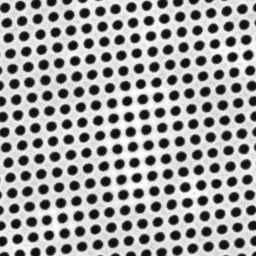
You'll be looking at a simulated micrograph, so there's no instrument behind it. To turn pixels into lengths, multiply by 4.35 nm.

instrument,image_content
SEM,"a regular array of holes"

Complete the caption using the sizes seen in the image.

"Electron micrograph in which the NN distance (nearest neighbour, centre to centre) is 66.3 nanometers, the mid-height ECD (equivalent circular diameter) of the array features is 0.0447 micrometres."